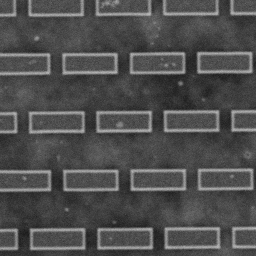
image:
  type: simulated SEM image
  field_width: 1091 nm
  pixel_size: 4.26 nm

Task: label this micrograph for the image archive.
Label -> an array of small figures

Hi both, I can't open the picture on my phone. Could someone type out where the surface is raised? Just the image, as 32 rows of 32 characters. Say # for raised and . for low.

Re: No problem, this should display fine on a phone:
##..######..#######..######..###
##..######..#######..######..###
................................
................................
................................
................................
................................
######..#######.#######..######.
######..#######.#######..######.
................................
................................
................................
................................
................................
##..######..#######..######..###
##..######..#######..######..###
................................
................................
................................
................................
................................
##......######...######..######.
######..#######.#######..######.
######..#######..######..######.
................................
................................
................................
................................
................................
##..######..#######..######..###
##..######..#######..######..###
................................